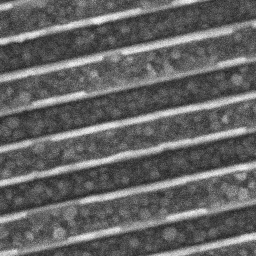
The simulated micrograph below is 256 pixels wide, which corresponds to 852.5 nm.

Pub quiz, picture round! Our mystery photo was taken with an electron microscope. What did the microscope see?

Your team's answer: one or a few lines or trenches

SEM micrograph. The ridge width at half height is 126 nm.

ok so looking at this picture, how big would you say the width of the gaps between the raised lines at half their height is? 103 nm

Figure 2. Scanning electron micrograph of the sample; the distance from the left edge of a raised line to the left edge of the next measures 231 nanometres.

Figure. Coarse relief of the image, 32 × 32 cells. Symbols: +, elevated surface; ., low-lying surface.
.++++++++++++++++++++++.........
++++++++++++++++++..............
++++++++++++++..................
+++++++++...................++++
+++++..................+++++++++
+..................+++++++++++++
..............++++++++++++++++++
..........++++++++++++++++++++++
.....++++++++++++++++++++++.....
++++++++++++++++++++++..........
++++++++++++++++++..............
+++++++++++++...................
+++++++++...................++++
++++..................++++++++++
..................++++++++++++++
.............+++++++++++++++++++
.........++++++++++++++++++++++.
.....+++++++++++++++++++++......
++++++++++++++++++++++..........
+++++++++++++++++...............
+++++++++++++..................+
++++++++..................++++++
++++..................++++++++++
.................+++++++++++++++
............++++++++++++++++++++
........+++++++++++++++++++++++.
...+++++++++++++++++++++++......
+++++++++++++++++++++...........
+++++++++++++++++...............
++++++++++++..................++
+++++++....................+++++
+++...................++++++++++